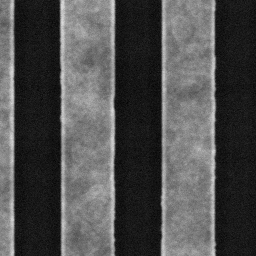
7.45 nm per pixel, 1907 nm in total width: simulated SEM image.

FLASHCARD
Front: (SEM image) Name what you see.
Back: lines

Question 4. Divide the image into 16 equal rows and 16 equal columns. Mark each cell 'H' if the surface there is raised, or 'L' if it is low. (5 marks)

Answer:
HLLLHHHLLLHHHLLL
HLLLHHHLLLHHHLLL
HLLLHHHLLLHHHLLL
HLLLHHHLLLHHHLLL
HLLLHHHLLLHHHLLL
HLLLHHHLLLHHHLLL
HLLLHHHLLLHHHLLL
HLLLHHHLLLHHHLLL
HLLLHHHLLLHHHLLL
HLLLHHHLLLHHHLLL
HLLLHHHLLLHHHLLL
HLLLHHHLLLHHHLLL
HLLLHHHLLLHHHLLL
HLLLHHHLLLHHHLLL
HLLLHHHLLLHHHLLL
HLLLHHHLLLHHHLLL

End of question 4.